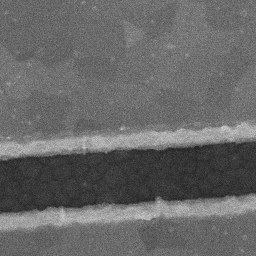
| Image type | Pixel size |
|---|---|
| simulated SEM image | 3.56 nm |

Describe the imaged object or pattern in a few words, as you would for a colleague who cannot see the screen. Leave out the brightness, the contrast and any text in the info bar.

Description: one or a few lines or trenches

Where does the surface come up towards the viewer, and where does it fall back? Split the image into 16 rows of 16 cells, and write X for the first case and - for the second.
XXXXXXXXXXXXXXXX
XXXXXXXXXXXXXXXX
XXXXXXXXXXXXXXXX
XXXXXXXXXXXXXXXX
XXXXXXXXXXXXXXXX
XXXXXXXXXXXXXXXX
XXXXXXXXXXXXXXXX
XXXXXXXXXXXXXXXX
XXXXXXXXXXXXX---
----------------
----------------
----------------
----------------
------XXXXXXXXXX
XXXXXXXXXXXXXXXX
XXXXXXXXXXXXXXXX